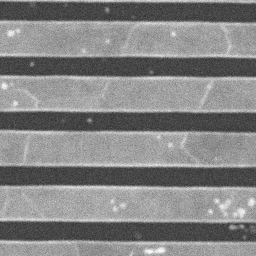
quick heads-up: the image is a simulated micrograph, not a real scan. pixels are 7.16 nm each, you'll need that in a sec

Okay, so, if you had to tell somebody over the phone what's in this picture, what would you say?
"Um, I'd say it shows wiring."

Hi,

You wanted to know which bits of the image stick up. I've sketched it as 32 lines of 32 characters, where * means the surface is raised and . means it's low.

................................
................................
................................
********************************
********************************
********************************
********************************
................................
................................
................................
********************************
********************************
********************************
********************************
................................
................................
***.............................
********************************
********************************
********************************
********************************
................................
................................
****************................
********************************
********************************
********************************
........************************
................................
................................
********************************
********************************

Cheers